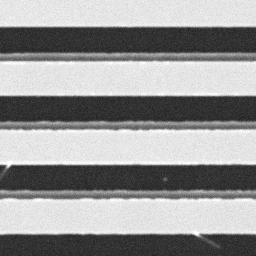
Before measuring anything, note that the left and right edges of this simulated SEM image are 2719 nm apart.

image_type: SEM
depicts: lines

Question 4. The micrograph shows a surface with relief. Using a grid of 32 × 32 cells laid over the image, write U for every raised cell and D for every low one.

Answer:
UUUUUUUUUUUUUUUUUUUUUUUUUUUUUUUU
UUUUUUUUUUUUUUUUUUUUUUUUUUUUUUUU
UUUUUUUUUUUUUUUUUUUUUUUUUUUUUUUU
DDDDDDDDDDDDDDDDDDDDDDDDDDDDDDDD
DDDDDDDDDDDDDDDDDDDDDDDDDDDDDDDD
DDDDDDDDDDDDDDDDDDDDDDDDDDDDDDDD
DDDDDDDDDDDDDDDDDDDDDDDDDDDDDDDD
UUUUUUUUUUUUUUUUUUUUUUUUUUUUUUUU
UUUUUUUUUUUUUUUUUUUUUUUUUUUUUUUU
UUUUUUUUUUUUUUUUUUUUUUUUUUUUUUUU
UUUUUUUUUUUUUUUUUUUUUUUUUUUUUUUU
UUUUUUUUUUUUUUUUUUUUUUUUUUUUUUUU
DDDDDDDDDDDDDDDDDDDDDDDDDDDDDDDD
DDDDDDDDDDDDDDDDDDDDDDDDDDDDDDDD
DDDDDDDDDDDDDDDDDDDDDDDDDDDDDDDD
UUUUUUUUUUUUUUUUUUUUUUUUUUUUUUUU
UUUUUUUUUUUUUUUUUUUUUUUUUUUUUUUU
UUUUUUUUUUUUUUUUUUUUUUUUUUUUUUUU
UUUUUUUUUUUUUUUUUUUUUUUUUUUUUUUU
UUUUUUUUUUUUUUUUUUUUUUUUUUUUUUUU
UUDDDDDDDDDDDDDDDDDDDDDDDDDDDDDD
DDDDDDDDDDDDDDDDDDDDDDDDDDDDDDDD
DDDDDDDDDDDDDDDDDDDDDDDDDDDDDDDD
DDDDDDDDDDDDDDDDDDDDDDDDDDDDDDDD
UUUUUUUUUUUUUUUUUUUUUUUUUUUUUUUU
UUUUUUUUUUUUUUUUUUUUUUUUUUUUUUUU
UUUUUUUUUUUUUUUUUUUUUUUUUUUUUUUU
UUUUUUUUUUUUUUUUUUUUUUUUUUUUUUUU
UUUUUUUUUUUUUUUUUUUUUUUUUUUUUUUU
DDDDDDDDDDDDDDDDDDDDDDDDDDDDDDDD
DDDDDDDDDDDDDDDDDDDDDDDDDDDDDDDD
DDDDDDDDDDDDDDDDDDDDDDDDDDDDDDDD